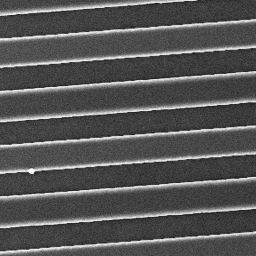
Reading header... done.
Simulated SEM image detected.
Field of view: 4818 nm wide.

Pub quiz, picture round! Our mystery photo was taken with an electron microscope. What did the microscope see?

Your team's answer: lines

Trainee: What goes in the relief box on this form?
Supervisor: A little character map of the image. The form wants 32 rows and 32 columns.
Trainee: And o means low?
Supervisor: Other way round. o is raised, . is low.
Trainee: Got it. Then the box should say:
oooooooooooooooooo..............
ooooo...........................
................................
...................ooooooooooooo
......oooooooooooooooooooooooooo
oooooooooooooooooooooooooooooooo
oooooooooooooooooooooooo........
oooooooooooo....................
................................
.........................ooooooo
............oooooooooooooooooooo
oooooooooooooooooooooooooooooooo
oooooooooooooooooooooooooooooooo
oooooooooooooooooooooo..........
ooooooooo.......................
................................
.......................ooooooooo
..........oooooooooooooooooooooo
oooooooooooooooooooooooooooooooo
oooooooooooooooooooooooooooo....
ooooooooooooooo.................
oo.o............................
............................oooo
...............ooooooooooooooooo
..oooooooooooooooooooooooooooooo
oooooooooooooooooooooooooooooooo
ooooooooooooooooooooooooo.......
ooooooooooooo...................
................................
..........................oooooo
..............oooooooooooooooooo
.ooooooooooooooooooooooooooooooo